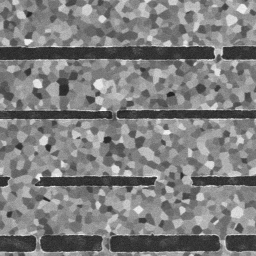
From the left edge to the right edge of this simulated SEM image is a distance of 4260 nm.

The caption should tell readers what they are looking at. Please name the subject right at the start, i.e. one or a few lines or trenches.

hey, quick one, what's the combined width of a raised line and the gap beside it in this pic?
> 1050 nm